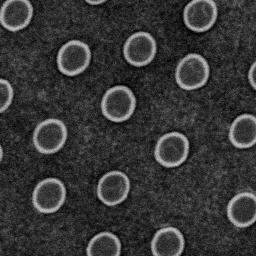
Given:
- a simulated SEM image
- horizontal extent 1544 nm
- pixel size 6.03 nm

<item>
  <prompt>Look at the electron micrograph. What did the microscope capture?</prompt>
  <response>a regular array of raised bodies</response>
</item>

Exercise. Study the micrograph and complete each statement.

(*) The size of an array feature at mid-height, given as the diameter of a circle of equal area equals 191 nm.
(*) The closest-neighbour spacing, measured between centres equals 0.357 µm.